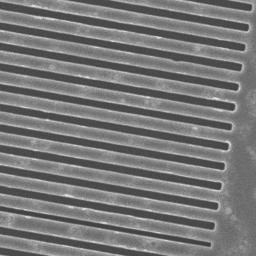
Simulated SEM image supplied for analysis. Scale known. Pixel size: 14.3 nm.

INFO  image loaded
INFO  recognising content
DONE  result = parallel lines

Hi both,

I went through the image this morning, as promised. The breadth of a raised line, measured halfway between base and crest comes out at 180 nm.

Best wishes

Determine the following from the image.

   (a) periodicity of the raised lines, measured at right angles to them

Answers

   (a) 288 nm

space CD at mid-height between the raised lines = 104 nanometres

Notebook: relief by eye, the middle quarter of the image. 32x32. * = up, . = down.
******............**************
************.............*******
******************............**
......******************........
...........******************...
******...........***************
************...........*********
******************...........***
.....******************.........
...........******************...
******...........***************
************...........*********
*****************............***
.....******************.........
...........******************...
****.............***************
**********.............*********
****************............****
.....*****************..........
...........****************.....
****.............***************
**********...........***********
****************...........*****
....*****************...........
.........******************.....
****...........*****************
********.............***********
**************.............*****
...*****************............
.........*****************......
**.............*****************
********.............***********